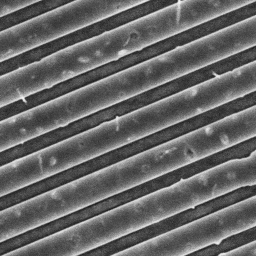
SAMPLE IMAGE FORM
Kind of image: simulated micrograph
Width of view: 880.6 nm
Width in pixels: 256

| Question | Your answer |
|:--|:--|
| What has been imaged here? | parallel lines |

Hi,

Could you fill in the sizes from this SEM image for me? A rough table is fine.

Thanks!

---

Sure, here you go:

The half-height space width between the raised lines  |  47.2 nm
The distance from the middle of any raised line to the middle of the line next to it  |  0.143 um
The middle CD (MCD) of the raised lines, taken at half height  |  97.5 nm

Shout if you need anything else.